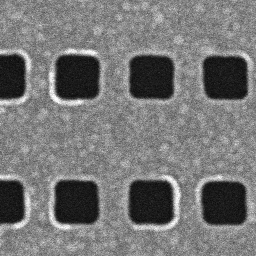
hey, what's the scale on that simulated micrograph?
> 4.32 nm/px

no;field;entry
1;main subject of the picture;holes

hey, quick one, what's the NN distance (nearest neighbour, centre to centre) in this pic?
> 320 nm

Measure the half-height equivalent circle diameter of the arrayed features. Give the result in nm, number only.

211